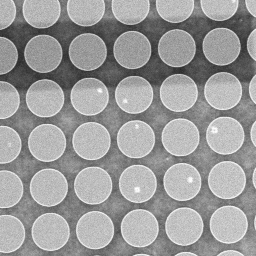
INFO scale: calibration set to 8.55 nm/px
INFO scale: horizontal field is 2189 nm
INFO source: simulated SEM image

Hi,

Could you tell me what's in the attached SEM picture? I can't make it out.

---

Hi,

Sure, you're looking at an array of small figures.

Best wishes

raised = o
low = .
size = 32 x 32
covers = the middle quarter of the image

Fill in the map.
...oooooo......ooooo.......ooo..
.....oo.........................
................................
...............ooooo......oooooo
...oooooo.....ooooooo....ooooooo
..oooooooo...ooooooooo..oooooooo
..ooooooooo..ooooooooo..oooooooo
..ooooooooo..ooooooooo..oooooooo
..ooooooooo..ooooooooo..oooooooo
..ooooooooo..ooooooooo...ooooooo
..oooooooo....ooooooo....ooooooo
...ooooooo.....ooooo.......oooo.
.....ooo........................
................................
................oooo.......ooooo
....oooooo.....oooooo....ooooooo
...oooooooo...oooooooo...ooooooo
...oooooooo..oooooooooo..ooooooo
..ooooooooo..oooooooooo..ooooooo
..ooooooooo..oooooooooo..ooooooo
..ooooooooo...oooooooo...ooooooo
...oooooooo...oooooooo....oooooo
...ooooooo.....oooooo......oooo.
.....oooo.......................
................................
.................ooo.......ooooo
.....ooooo.....ooooooo....oooooo
....ooooooo...oooooooo...ooooooo
...ooooooooo..ooooooooo..ooooooo
o..ooooooooo..ooooooooo..ooooooo
o..ooooooooo..ooooooooo..ooooooo
o..ooooooooo..ooooooooo..ooooooo